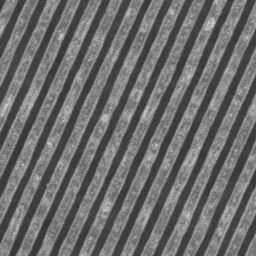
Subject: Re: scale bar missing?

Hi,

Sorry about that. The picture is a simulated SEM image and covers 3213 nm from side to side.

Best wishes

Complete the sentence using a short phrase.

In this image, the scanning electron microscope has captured parallel lines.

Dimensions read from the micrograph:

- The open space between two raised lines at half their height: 110 nanometers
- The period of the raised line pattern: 238 nm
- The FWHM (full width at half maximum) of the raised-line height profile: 123 nm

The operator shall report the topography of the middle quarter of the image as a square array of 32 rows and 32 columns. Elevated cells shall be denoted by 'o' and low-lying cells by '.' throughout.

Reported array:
oo..ooo..ooo...oo...ooo..ooo..oo
o...ooo..ooo..ooo..ooo...ooo..oo
o..ooo..ooo...ooo..ooo..ooo...oo
...oo...ooo..ooo..ooo...ooo..ooo
..ooo...oo...ooo..ooo..ooo...oo.
..ooo..ooo...oo...oo...ooo..ooo.
..oo...ooo..ooo..ooo..ooo...oo..
.ooo..ooo...oo...ooo..ooo..ooo..
.oo...ooo..ooo..ooo...oo...oo...
ooo..ooo...ooo..ooo..ooo..ooo...
oo...ooo..ooo...oo...oo...ooo..o
oo..ooo...oo...ooo..ooo...oo...o
o...ooo...oo...oo...oo...ooo..oo
o..ooo...oo...ooo..ooo...oo...oo
o..ooo...oo...oo...ooo..ooo..ooo
...oo...ooo..ooo..ooo...oo...ooo
..ooo...oo...oo...ooo..ooo..ooo.
..ooo..ooo..ooo...oo...oo...ooo.
..oo...oo...ooo..ooo..ooo..ooo..
.ooo..ooo..ooo...oo...ooo..ooo..
.oo...oo...ooo..ooo..ooo..ooo...
ooo..ooo...oo...ooo..ooo..ooo...
oo...ooo..ooo..ooo..ooo...ooo..o
oo..ooo..ooo...oo...ooo..ooo..oo
o...ooo..ooo..ooo..ooo...ooo..oo
o..ooo...oo...oo...ooo..ooo..ooo
o..ooo..ooo..ooo...ooo..oo...ooo
...oo...ooo..ooo..ooo..ooo...oo.
..ooo..ooo..ooo...ooo..ooo..ooo.
..ooo..ooo..ooo..ooo...oo...oo..
.ooo...oo..oooo..ooo..ooo..ooo..
.ooo..ooo..ooo..ooo...oo...ooo..